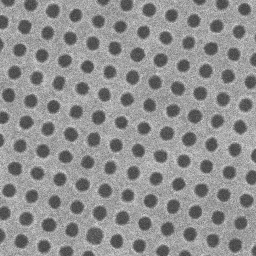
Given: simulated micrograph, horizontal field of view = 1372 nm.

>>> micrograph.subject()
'a regular array of holes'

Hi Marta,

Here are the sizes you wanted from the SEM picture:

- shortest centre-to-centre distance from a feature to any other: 122 nanometres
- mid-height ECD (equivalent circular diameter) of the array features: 77.3 nm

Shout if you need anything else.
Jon